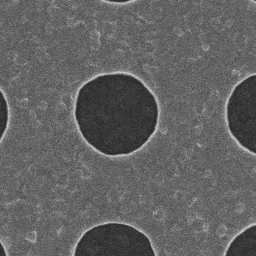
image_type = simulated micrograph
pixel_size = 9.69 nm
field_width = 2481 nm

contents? holes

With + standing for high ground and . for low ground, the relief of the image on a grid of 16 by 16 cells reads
++++++++++++++++
++++++++++++++++
++++++++++++++++
++++++++++++++++
++++++++++++++++
+++++....++++++.
+++++.....++++..
+++++.....++++..
+++++....++++++.
++++++..++++++++
++++++++++++++++
++++++++++++++++
++++++++++++++++
++++++++++++++++
+++++....++++++.
+++++.....++++..